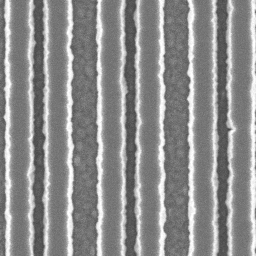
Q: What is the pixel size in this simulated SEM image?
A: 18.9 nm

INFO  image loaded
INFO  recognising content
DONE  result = parallel lines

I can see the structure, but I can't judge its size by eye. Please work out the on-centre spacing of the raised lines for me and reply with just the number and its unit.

838 nanometers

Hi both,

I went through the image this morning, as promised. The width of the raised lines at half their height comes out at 478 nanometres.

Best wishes